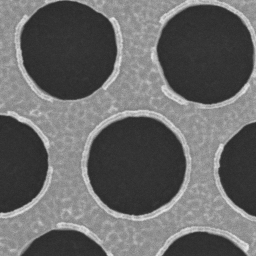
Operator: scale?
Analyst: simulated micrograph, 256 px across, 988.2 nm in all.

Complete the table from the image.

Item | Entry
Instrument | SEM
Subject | holes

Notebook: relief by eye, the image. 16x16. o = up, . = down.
ooo...oooooo..oo
oo.....ooo.....o
o......ooo......
o......ooo......
oo.....ooo......
oo....ooooo....o
oooooooooooooooo
.oooooo...oooooo
..oooo.....oooo.
...ooo.....ooo..
...oo.......oo..
...ooo.....ooo..
..oooo.....ooo..
oooooooooooooooo
ooo..ooooooo.ooo
oo....oooo.....o